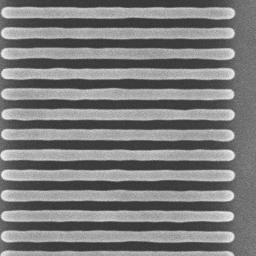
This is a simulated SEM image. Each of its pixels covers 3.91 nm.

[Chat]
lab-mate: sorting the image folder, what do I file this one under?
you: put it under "groups of lines, slits or small figures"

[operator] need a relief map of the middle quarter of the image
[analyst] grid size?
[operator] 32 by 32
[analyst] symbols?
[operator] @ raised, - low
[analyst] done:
--------------------------------
@@@@@@@@@@@@@@@@@@@@@@@@@@@@@@@@
@@@@@@@@@@@@@@@@@@@@@@@@@@@@@@@@
@@@@@@@@@@@@@@@@@@@@@@@@@@@@@@@@
--------------------------------
--------------------------------
@@@@@@@@@@@@@@@@@@@@@@@@@@@@@@@@
@@@@@@@@@@@@@@@@@@@@@@@@@@@@@@@@
@@@@@@@@@@@@@@@@@@@@@@@@@@@@@@@@
--------------------------------
--------------------------------
@@@@@@@@@@---@@@@@@@@@@@@@@-----
@@@@@@@@@@@@@@@@@@@@@@@@@@@@@@@@
@@@@@@@@@@@@@@@@@@@@@@@@@@@@@@@@
--------------------------------
--------------------------------
@@@@@@@@@@@@@@@@@@@@@@@@@@@@@-@@
@@@@@@@@@@@@@@@@@@@@@@@@@@@@@@@@
@@@@@@@@@@@@@@@@@@@@@@@@@@@@@@@@
--------------------------------
--------------------------------
--------------------------------
@@@@@@@@@@@@@@@@@@@@@@@@@@@@@@@@
@@@@@@@@@@@@@@@@@@@@@@@@@@@@@@@@
--------------------------------
--------------------------------
@@@--------@@@@----------@------
@@@@@@@@@@@@@@@@@@@@@@@@@@@@@@@@
@@@@@@@@@@@@@@@@@@@@@@@@@@@@@@@@
--------------------------------
--------------------------------
--------------------------------